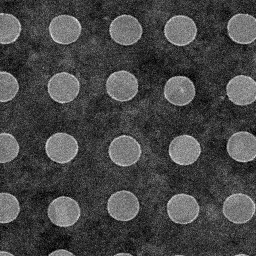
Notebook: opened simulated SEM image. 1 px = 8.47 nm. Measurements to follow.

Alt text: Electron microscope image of a regular array of raised bodies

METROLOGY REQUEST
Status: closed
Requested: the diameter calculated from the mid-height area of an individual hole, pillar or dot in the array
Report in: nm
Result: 260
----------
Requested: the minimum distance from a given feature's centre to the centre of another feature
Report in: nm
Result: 476